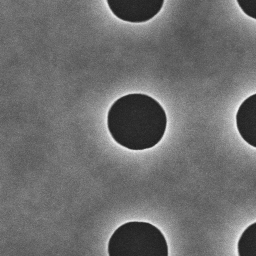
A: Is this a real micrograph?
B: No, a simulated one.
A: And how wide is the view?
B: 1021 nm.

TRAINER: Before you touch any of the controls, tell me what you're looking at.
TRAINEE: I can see holes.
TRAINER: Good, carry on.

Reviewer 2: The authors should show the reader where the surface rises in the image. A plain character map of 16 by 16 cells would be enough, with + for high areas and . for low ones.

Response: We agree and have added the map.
+++++++...+++++.
++++++++++++++++
++++++++++++++++
++++++++++++++++
++++++++++++++++
++++++++++++++++
+++++++...+++++.
+++++++...+++++.
+++++++...+++++.
++++++++++++++++
++++++++++++++++
++++++++++++++++
++++++++++++++++
++++++++++++++++
+++++++...+++++.
+++++++...+++++.